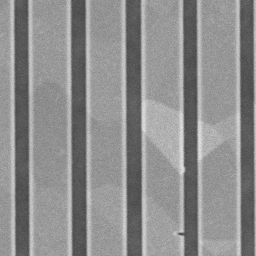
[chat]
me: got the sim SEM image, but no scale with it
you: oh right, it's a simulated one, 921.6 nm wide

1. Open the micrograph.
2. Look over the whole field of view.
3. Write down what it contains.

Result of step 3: parallel lines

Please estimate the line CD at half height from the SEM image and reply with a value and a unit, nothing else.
138 nanometers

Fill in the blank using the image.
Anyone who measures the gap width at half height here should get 0.0648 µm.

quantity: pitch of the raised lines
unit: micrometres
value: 0.203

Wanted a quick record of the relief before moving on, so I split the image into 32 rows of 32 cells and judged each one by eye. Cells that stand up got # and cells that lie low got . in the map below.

##..#####..####...#####..#####..
##..#####..####...#####..#####..
##..#####..####...#####..#####..
##..#####..####...#####..#####..
##..#####..####...#####..#####..
##..#####..####...#####..#####..
##..#####..####...#####..#####..
##..#####..####...#####..#####..
##..#####..####...#####..#####..
##..#####..####...#####..#####..
##..#####..####...#####..#####..
##..#####..####...#####..#####..
##..#####..####...#####..#####..
##..#####..####...#####..#####..
##..#####..####...#####..#####..
##..#####..####...#####..#####..
##..#####..####...#####..#####..
##..#####..####...#####..#####..
##..#####..####...#####..#####..
##..#####..####...#####..#####..
##..#####..####...#####..#####..
##..#####..####...#####..#####..
##..#####..####...#####..#####..
##..#####..####...#####..#####..
##..#####..####...#####..#####..
##..#####..####...#####..#####..
##..#####..#####..#####..#####..
##..#####..#####..#####..#####..
##..#####..#####..#####..#####..
##..#####..#####..#####..#####..
##..#####..#####..#####..#####..
##..#####..#####..#####..#####..